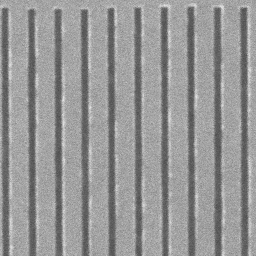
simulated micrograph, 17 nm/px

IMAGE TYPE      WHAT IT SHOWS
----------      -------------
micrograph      parallel lines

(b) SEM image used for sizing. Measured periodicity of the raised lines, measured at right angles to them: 452 nm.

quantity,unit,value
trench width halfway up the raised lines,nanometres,141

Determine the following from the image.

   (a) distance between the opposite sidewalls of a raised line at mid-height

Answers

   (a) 313 nanometers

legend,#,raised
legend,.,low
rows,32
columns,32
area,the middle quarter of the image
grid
####..#####..####...####..#####.
####..#####..####...####..#####.
####..#####..####...####..#####.
####..#####..####...####..#####.
####..#####..####...####..#####.
####..#####..####...####..#####.
####..#####..####...####..#####.
####..#####..####...####..#####.
####..#####..####...####..#####.
####..#####..####...####..#####.
####..#####..####...####..#####.
####..#####..####...####..#####.
####..#####..####...####..#####.
####..#####..####...####..#####.
####..#####..####...####..#####.
####..#####..####...####..#####.
####..#####..####...####..#####.
####..#####..#####..####..#####.
####..#####..#####..####..#####.
####..#####..####...####..#####.
####..#####..####...####..#####.
####..#####..####...####..#####.
####..#####..####...####..#####.
####..#####..####...####..#####.
####..#####..####...####..#####.
####..#####..####...####..#####.
####..#####..####...####..#####.
####..#####..####...####..#####.
####...####..####...####..#####.
####...####..####...####..#####.
####...####..#####..####..#####.
####...####..#####..####..#####.